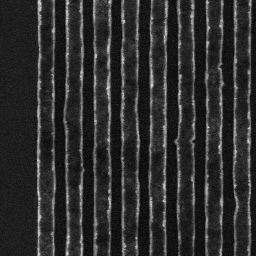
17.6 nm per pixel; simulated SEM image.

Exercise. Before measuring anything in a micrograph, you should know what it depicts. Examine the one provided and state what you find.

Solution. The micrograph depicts parallel lines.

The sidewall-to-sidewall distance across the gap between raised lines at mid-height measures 223 nm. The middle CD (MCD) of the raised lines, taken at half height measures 276 nm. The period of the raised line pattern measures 28 px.